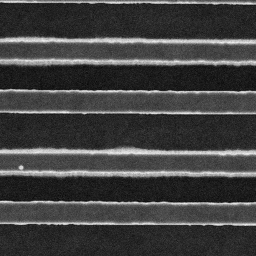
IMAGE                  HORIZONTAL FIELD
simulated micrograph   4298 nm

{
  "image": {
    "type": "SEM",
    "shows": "lines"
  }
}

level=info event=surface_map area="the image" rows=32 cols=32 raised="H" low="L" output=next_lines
LLLLLLLLLLLLLLLLLLLLLLLLLLLLLLLL
LLLLLLLLLLLLLLLLLLLLLLLLLLLLLLLL
LLLLLLLLLLLLLLLLLLLLLLLLLLLLLLLL
LLLLLLLLLLLLLLLLLLLLLLLLLLLLLLLL
LLLLLLLLLLLLLLLLLLLLLLLLLLLLLLLL
HHHHHHHHHHHHHHHHHHHHHHHHHHHHHHHH
HHHHHHHHHHHHHHHHHHHHHHHHHHHHHHHH
HHHHHHHHHHHHHHHHHHHHHHHHHHHHHHHH
LLLLLLLLLLLLLLLLLLLLLLLLLLLLLLLL
LLLLLLLLLLLLLLLLLLLLLLLLLLLLLLLL
LLLLLLLLLLLLLLLLLLLLLLLLLLLLLLLL
HHHHHHHHHHHHHHHHHHHHHHHHHHHHHHHH
HHHHHHHHHHHHHHHHHHHHHHHHHHHHHHHH
HHHHHHHHHHHHHHHHHHHHHHHHHHHHHHHH
LLLLLLLLLLLLLLLLLLLLLLLLLLLLLLLL
LLLLLLLLLLLLLLLLLLLLLLLLLLLLLLLL
LLLLLLLLLLLLLLLLLLLLLLLLLLLLLLLL
LLLLLLLLLLLLLLLLLLLLLLLLLLLLLLLL
LLLLLLLLLLLLLLLLLLLLLLLLLLLLLLLL
HHHHHHHHHHHHHHHHHHHHHHHHHHHHHHHH
HHHHHHHHHHHHHHHHHHHHHHHHHHHHHHHH
HHHHHHHHHHHHHHHHHHHHHHHHHHHHHHHH
LLLLLLLLLLLLLLLLLLLLLLLLLLLLLLLL
LLLLLLLLLLLLLLLLLLLLLLLLLLLLLLLL
LLLLLLLLLLLLLLLLLLLLLLLLLLLLLLLL
HHHHHHHHHHHHHHHHHHHHHHHHHHHHHHHH
HHHHHHHHHHHHHHHHHHHHHHHHHHHHHHHH
HHHHHHHHHHHHHHHHHHHHHHHHHHHHHHHH
LLLLLLLLLLLLLLLLLLLLLLLLLLLLLLLL
LLLLLLLLLLLLLLLLLLLLLLLLLLLLLLLL
LLLLLLLLLLLLLLLLLLLLLLLLLLLLLLLL
LLLLLLLLLLLLLLLLLLLLLLLLLLLLLLLL